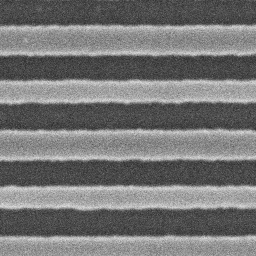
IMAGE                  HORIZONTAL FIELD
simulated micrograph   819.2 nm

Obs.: lines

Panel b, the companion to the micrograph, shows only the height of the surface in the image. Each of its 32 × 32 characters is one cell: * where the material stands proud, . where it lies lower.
................................
................................
................................
********************************
********************************
********************************
********************************
................................
................................
................................
********************************
********************************
********************************
................................
................................
................................
********************************
********************************
********************************
********************************
................................
................................
................................
**.*****************************
********************************
********************************
................................
................................
................................
................................
********************************
********************************